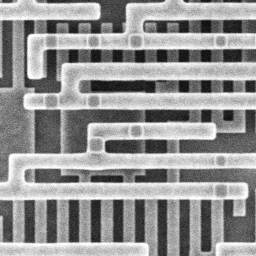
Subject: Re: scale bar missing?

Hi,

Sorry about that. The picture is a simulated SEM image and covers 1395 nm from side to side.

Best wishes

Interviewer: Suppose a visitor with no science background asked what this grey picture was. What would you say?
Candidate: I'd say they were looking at wiring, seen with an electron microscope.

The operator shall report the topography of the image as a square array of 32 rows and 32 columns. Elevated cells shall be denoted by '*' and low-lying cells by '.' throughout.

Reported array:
************....****************
************....****************
................**..............
................**..............
....****************************
....****************************
....**..........................
....*...........................
....*...************************
....*...************************
........**......................
.......***......................
...*****************************
...*****************************
................................
...........****************.....
...........****************.....
...........***..................
...........**...................
.*******************************
.*******************************
.**.............................
.**.............................
*******************************.
*******************************.
................................
................................
................................
................................
................................
*****.************.........*****
*******************........*****